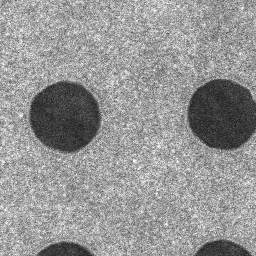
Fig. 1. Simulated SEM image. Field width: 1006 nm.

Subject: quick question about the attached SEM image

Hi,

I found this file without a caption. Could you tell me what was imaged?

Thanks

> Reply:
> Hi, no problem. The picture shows holes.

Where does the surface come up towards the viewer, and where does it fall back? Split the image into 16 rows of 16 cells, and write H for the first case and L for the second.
HHHHHHHHHHHHHHHH
HHHHHHHHHHHHHHHH
HHHHHHHHHHHHHHHH
HHHHHHHHHHHHHHHH
HHHHHHHHHHHHHHHH
HHHLLHHHHHHHLLLH
HHLLLLHHHHHHLLLL
HHLLLLHHHHHHLLLL
HHLLLLHHHHHHLLLL
HHHHLHHHHHHHHHHH
HHHHHHHHHHHHHHHH
HHHHHHHHHHHHHHHH
HHHHHHHHHHHHHHHH
HHHHHHHHHHHHHHHH
HHHHHHHHHHHHHHHH
HHHLLHHHHHHHHLLH